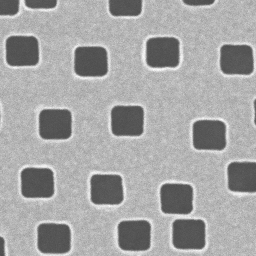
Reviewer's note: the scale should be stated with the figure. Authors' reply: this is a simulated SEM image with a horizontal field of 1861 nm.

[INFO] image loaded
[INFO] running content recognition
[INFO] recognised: a regular array of holes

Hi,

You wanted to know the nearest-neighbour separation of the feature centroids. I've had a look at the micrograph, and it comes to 444 nanometers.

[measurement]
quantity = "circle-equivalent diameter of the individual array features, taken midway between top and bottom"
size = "252 nanometers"